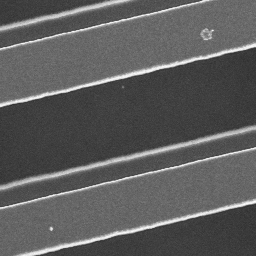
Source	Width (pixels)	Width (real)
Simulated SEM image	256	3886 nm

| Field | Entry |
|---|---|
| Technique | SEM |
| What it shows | lines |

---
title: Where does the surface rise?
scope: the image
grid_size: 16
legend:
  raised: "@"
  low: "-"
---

------@@@@@@@@@@
--@@@@@@@@@@@@@@
@@@@@@@@@@@@@@@@
@@@@@@@@@@@@@@--
@@@@@@@@@-------
@@@@@-----------
@---------------
----------------
--------------@@
----------@@@@@@
------@@@@@@@@@@
-@@@@@@@@@@@@@@@
@@@@@@@@@@@@@@@@
@@@@@@@@@@@@----
@@@@@@@@--------
@@@@------------